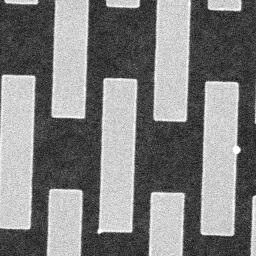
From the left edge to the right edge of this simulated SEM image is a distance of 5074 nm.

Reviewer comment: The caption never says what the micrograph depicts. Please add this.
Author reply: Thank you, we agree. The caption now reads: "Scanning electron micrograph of groups of lines, slits or small figures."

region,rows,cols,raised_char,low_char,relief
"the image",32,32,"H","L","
LLLLLLLHHHHLLLHHHLLLHHHHLLHHHHLL
LLLLLLLHHHHLLLLLLLLLHHHHLLLLLLLL
LLLLLLLHHHHLLLLLLLLLHHHHLLLLLLLL
LLLLLLLHHHHLLLLLLLLLHHHHLLLLLLLL
LLLLLLLHHHHLLLLLLLLLHHHHLLLLLLLL
LLLLLLLHHHHLLLLLLLLLHHHHLLLLLLLL
LLLLLLLHHHHLLLLLLLLLHHHHLLLLLLLL
LLLLLLLHHHHLLLLLLLLLHHHLLLLLLLLL
LLLLLLLHHHHLLLLLLLLHHHHLLLLLLLLL
LHLLLLLHHHHLLLLLLLLHHHHLLLLLLLLL
HHHHLLLHHHHLLHHHHLLHHHHLLLHHHLLL
HHHHLLLHHHHLLHHHHLLHHHHLLLHHHHLL
HHHHLLLHHHHLLHHHHLLHHHHLLLHHHHLL
HHHHLLLHHHHLLHHHHLLHHHHLLLHHHHLL
HHHHLLLHHHLLLHHHHLLHHHHLLLHHHHLL
HHHHLLLLLLLLLHHHHLLLLLLLLLHHHHLL
HHHHLLLLLLLLLHHHHLLLLLLLLLHHHHLL
HHHHLLLLLLLLLHHHHLLLLLLLLLHHHHLL
HHHHLLLLLLLLLHHHHLLLLLLLLLHHHHLL
HHHHLLLLLLLLLHHHHLLLLLLLLLHHHHLL
HHHHLLLLLLLLLHHHHLLLLLLLLLHHHLLL
HHHHLLLLLLLLLHHHHLLLLLLLLHHHHLLL
HHHHLLLLLLLLLHHHHLLLLLLLLHHHHLLL
HHHHLLLLLLLLLHHHHLLLLLLLLHHHHLLL
HHHHLLHHHHLLLHHHHLLHHHHLLHHHHLLL
HHHHLLHHHHLLLHHHHLLHHHHLLHHHHLLL
HHHHLLHHHHLLLHHHHLLHHHHLLHHHHLLL
HHHHLLHHHHLLLHHHLLLHHHHLLHHHHLLL
LLHLLLHHHHLLHHHHLLLHHHHLLHHHHLLL
LLLLLLHHHHLLLLLLLLLHHHHLLLLLLLLL
LLLLLLHHHHLLLLLLLLLHHHHLLLLLLLLL
LLLLLLHHHHLLLLLLLLLHHHHLLLLLLLLL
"